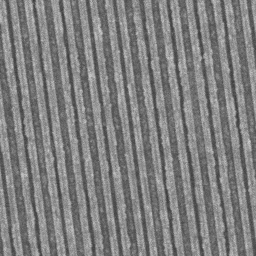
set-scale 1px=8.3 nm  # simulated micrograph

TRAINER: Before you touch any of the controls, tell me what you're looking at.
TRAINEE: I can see parallel lines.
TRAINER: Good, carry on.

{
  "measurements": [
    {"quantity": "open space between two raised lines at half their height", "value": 64.8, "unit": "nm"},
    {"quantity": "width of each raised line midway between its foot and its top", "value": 6.82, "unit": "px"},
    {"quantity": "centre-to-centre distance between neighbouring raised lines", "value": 111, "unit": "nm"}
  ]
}